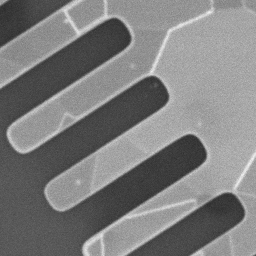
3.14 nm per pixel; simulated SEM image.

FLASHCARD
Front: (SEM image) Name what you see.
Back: groups of lines, slits or small figures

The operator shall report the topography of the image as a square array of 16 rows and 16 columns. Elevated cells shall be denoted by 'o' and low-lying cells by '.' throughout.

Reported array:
....oooooooooooo
..oooo..oooooooo
.oooo...oooooooo
ooo....ooooooooo
oo....oooooooooo
....oooo..oooooo
...ooo....oooooo
.oooo....ooooooo
.oo.....oooooooo
.o....oooo...ooo
....oooo....oooo
...oooo....ooooo
...oo....oooo..o
........oooo...o
......oooo....oo
.....oooo....ooo